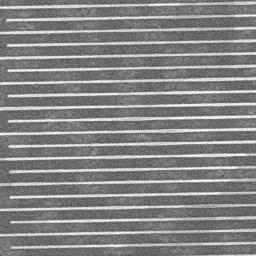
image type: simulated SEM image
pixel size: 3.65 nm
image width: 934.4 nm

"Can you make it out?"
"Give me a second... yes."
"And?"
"parallel lines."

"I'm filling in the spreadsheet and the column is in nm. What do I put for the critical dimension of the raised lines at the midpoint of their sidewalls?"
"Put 5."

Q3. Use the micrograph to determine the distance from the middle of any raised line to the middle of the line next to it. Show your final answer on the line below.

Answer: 46.1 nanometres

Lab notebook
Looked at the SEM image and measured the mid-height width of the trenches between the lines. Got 40.6 nanometers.